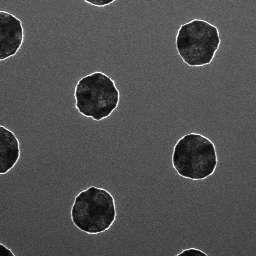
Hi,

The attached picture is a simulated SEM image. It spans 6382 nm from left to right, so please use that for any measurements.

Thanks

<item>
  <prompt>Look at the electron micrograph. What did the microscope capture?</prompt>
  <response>raised bodies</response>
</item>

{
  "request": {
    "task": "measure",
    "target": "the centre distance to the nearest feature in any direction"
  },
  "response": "2850 nanometers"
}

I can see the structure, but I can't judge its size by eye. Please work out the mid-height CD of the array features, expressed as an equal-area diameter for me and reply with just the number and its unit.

1120 nanometers